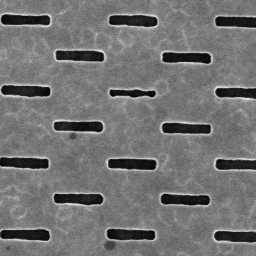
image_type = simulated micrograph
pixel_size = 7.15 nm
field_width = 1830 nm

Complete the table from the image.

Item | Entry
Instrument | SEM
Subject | a regular array of holes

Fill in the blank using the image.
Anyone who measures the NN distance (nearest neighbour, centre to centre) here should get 453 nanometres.